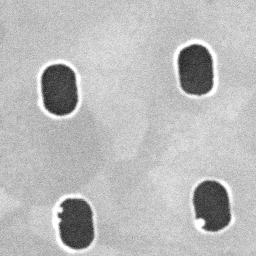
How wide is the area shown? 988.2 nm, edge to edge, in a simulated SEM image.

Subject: holes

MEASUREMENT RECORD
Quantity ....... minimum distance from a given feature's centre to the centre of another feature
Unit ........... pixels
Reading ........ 136